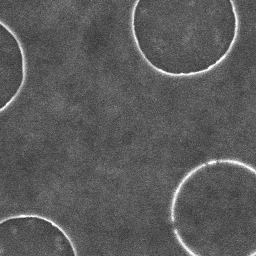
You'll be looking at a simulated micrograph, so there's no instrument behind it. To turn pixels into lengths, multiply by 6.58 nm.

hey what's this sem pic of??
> holes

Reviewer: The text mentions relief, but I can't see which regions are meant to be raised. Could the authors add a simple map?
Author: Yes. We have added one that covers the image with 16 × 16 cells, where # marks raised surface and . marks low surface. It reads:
########.......#
########.......#
.########......#
.########.....##
.#########..####
.###############
################
################
################
################
################
################
################
################
....############
.....###########